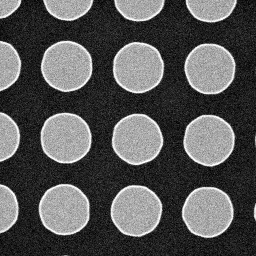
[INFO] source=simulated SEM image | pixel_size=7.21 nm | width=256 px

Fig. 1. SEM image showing an array of small figures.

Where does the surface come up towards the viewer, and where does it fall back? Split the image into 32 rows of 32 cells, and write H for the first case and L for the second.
HHLLLLHHHHHLLLHHHHHHLLLHHHHHHLLL
HHLLLLHHHHHLLLLHHHHHLLLLHHHHHLLL
LLLLLLLLHLLLLLLLHHLLLLLLLHHLLLLL
LLLLLLLLLLLLLLLLLLLLLLLLLLLLLLLL
LLLLLLLLLLLLLLLLLLLLLLLLLLLLLLLL
HLLLLLLHHHLLLLLLHHLLLLLLLLLLLLLL
HHLLLLHHHHHLLLLHHHHHLLLLHHHHHLLL
HHLLLHHHHHHLLLHHHHHHLLLHHHHHHLLL
HHHLLHHHHHHLLLHHHHHHLLLHHHHHHLLL
HHLLLHHHHHHLLLHHHHHHLLLHHHHHHLLL
HHLLLLHHHHHLLLLHHHHHLLLLHHHHHLLL
LLLLLLLLLLLLLLLLHHLLLLLLLHHLLLLL
LLLLLLLLLLLLLLLLLLLLLLLLLLLLLLLL
LLLLLLLLLLLLLLLLLLLLLLLLLLLLLLLL
HLLLLLLHHHLLLLLLHHLLLLLLLHHLLLLL
HHLLLLHHHHHLLLLHHHHHLLLLHHHHLLLL
HHLLLHHHHHHLLLHHHHHHLLLHHHHHHLLL
HHLLLHHHHHHLLLHHHHHHLLLHHHHHHLLL
HHLLLHHHHHHLLLHHHHHHLLLHHHHHHLLL
HLLLLLHHHHLLLLLHHHHLLLLLHHHHHLLL
LLLLLLLLLLLLLLLLHHLLLLLLLHHLLLLL
LLLLLLLLLLLLLLLLLLLLLLLLLLLLLLLL
LLLLLLLLLLLLLLLLLLLLLLLLLLLLLLLL
HLLLLLLHHHLLLLLLHHLLLLLLLHHLLLLL
HHLLLHHHHHHLLLLHHHHHLLLLHHHHLLLL
HHLLLHHHHHHLLLHHHHHHLLLHHHHHHLLL
HHLLLHHHHHHLLLHHHHHHLLLHHHHHHLLL
HHLLLHHHHHHLLLHHHHHHLLLHHHHHHLLL
HLLLLLHHHHLLLLLHHHHLLLLLHHHHLLLL
LLLLLLLLLLLLLLLLLLLLLLLLLHHLLLLL
LLLLLLLLLLLLLLLLLLLLLLLLLLLLLLLL
LLLLLLLLLLLLLLLLLLLLLLLLLLLLLLLL